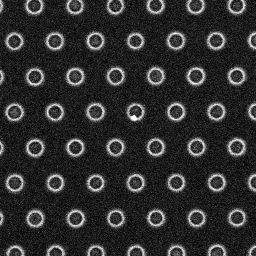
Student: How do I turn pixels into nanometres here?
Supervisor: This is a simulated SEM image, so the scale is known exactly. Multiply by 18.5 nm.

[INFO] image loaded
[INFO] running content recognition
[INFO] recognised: a regular array of holes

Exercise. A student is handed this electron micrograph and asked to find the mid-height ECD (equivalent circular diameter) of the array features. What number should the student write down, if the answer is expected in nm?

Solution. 255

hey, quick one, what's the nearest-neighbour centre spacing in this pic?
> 741 nm